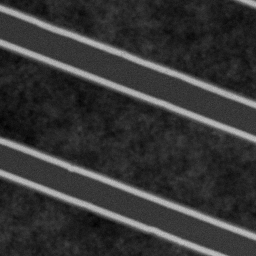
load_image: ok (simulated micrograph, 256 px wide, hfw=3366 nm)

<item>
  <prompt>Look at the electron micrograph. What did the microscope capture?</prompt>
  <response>one or a few lines or trenches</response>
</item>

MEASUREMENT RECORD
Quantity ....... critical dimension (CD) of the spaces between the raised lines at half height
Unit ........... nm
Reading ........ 1210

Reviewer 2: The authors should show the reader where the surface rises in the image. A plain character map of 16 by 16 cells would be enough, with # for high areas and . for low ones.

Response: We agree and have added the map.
................
###.............
#####...........
..######........
.....######.....
.......######...
..........######
.............###
...............#
##..............
####............
..#####.........
....######......
.......#####....
..........#####.
............####